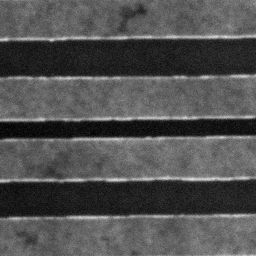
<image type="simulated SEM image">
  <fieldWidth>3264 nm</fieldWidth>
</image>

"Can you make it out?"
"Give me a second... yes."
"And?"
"lines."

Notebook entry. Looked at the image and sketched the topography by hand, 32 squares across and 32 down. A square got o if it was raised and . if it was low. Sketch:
oooooooooooooooooooooooooooooooo
oooooooooooooooooooooooooooooooo
oooooooooooooooooooooooooooooooo
oooooooooooooooooooooooooooooooo
oooooooooooooooooooooooooooooooo
................................
................................
................................
................................
.............................ooo
oooooooooooooooooooooooooooooooo
oooooooooooooooooooooooooooooooo
oooooooooooooooooooooooooooooooo
oooooooooooooooooooooooooooooooo
oooooooooooooooooooooooooooooooo
................................
................................
oooooooooooooooooooooooooooooooo
oooooooooooooooooooooooooooooooo
oooooooooooooooooooooooooooooooo
oooooooooooooooooooooooooooooooo
oooooooooooooooooooooooooooooooo
oooooooooo...ooo................
................................
................................
................................
................................
oooooooooooooooooooooooooooooooo
oooooooooooooooooooooooooooooooo
oooooooooooooooooooooooooooooooo
oooooooooooooooooooooooooooooooo
oooooooooooooooooooooooooooooooo